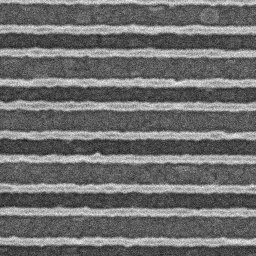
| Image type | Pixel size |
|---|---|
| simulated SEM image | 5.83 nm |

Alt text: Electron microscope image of parallel lines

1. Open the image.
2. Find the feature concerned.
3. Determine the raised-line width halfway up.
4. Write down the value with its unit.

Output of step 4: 0.0372 micrometres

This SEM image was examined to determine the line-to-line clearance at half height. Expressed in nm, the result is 127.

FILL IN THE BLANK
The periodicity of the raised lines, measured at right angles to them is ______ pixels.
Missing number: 26.5